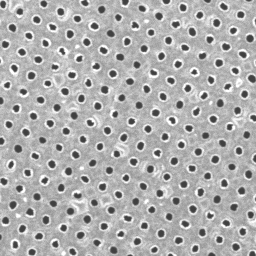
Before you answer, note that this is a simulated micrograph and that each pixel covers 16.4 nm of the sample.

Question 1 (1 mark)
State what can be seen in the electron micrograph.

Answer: a regular array of holes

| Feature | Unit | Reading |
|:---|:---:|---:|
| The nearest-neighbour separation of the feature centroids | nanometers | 288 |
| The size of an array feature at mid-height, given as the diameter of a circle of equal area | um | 0.12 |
